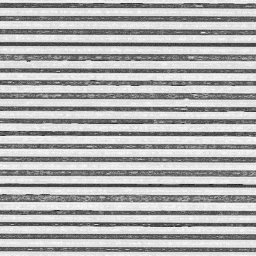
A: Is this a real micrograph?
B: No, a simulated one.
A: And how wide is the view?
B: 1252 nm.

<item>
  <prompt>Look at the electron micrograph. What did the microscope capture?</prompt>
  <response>parallel lines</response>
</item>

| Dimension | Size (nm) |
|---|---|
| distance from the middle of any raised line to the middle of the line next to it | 62.8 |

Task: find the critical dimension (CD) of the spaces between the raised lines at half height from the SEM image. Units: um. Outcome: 0.03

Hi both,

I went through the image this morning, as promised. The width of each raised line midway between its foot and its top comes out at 30.6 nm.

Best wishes